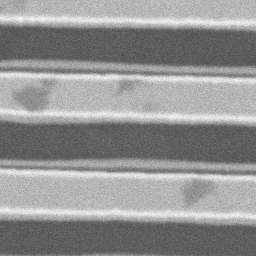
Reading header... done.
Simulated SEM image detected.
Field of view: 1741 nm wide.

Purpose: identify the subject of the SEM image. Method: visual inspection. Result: lines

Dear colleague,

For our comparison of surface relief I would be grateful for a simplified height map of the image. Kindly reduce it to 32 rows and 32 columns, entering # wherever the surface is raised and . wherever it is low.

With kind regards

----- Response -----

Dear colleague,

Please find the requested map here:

################################
################################
################################
................................
................................
................................
................................
................................
##########......................
################################
################################
################################
################################
################################
...###.#########################
................................
................................
................................
................................
................................
................................
################################
################################
################################
################################
################################
################################
................................
................................
................................
................................
................................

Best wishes